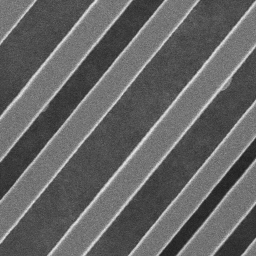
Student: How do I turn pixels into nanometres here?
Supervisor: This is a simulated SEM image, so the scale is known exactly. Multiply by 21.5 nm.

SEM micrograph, lines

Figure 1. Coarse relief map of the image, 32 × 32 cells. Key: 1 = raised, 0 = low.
11110000000011110000111100000000
11100000000111100001111100000001
11100000001111100001111000000011
11000000011111000011110000000111
10000000111110000111100000001111
00000001111100001111000000001111
00000001111000011111000000011110
00000011110000111110000000111110
00000111110000111100000001111100
00001111100001111000000011111000
00011111000011110000000011110000
00011110000111110000000111100000
00111100001111100000001111100000
01111100001111000000011111000001
11111000011110000000111110000011
11110000111100000001111100000111
11100001111000000001111000000111
11000011111000000011110000001111
10000111110000000111110000011110
10000111100000001111100000111100
00001111000000011111000001111001
00011110000000011110000001110001
00111110000000111100000011110011
01111100000001111100000111100111
01111000000011111000001111001111
11110000000111110000011110011111
11100000001111100000111100011110
11000000001111000000111100111100
11000000011110000001111001111100
10000000111110000011110011111000
00000001111100000111100111110001
00000011111000001111001111100001